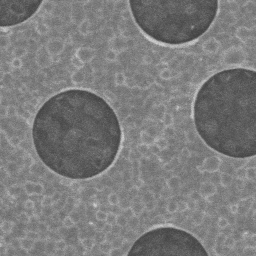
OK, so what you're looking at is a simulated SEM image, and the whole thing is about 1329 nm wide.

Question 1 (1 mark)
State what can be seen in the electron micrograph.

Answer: holes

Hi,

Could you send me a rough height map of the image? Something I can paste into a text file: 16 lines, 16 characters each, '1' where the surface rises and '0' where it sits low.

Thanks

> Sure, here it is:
0011111100000011
0111111110000111
1111111111001111
1111111111111111
1111111111111100
1111111111111000
1110000111110000
1100000111110000
1100000011111000
1100000111111100
1110000111111111
1111111111111111
1111111111111111
1111111111111111
1111111110001111
1111111100000111